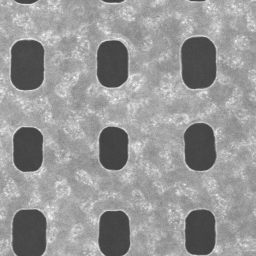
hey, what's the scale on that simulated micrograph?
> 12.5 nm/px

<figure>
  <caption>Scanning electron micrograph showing holes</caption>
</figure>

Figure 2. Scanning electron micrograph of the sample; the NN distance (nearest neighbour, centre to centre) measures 1050 nanometers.